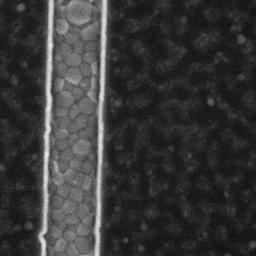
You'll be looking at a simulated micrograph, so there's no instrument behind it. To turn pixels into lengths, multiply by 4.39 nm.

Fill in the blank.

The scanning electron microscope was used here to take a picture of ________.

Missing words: one or a few lines or trenches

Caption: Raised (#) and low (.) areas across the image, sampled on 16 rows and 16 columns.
###....#########
###...##########
###...##########
###...##########
###...##########
###...##########
###...##########
###...##########
###...##########
###...##########
###...##########
###...##########
###...##########
###...##########
###...##########
###...##########